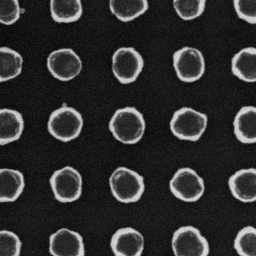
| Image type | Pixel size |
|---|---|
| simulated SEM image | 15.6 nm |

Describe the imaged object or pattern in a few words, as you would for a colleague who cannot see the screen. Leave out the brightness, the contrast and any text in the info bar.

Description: a regular array of raised bodies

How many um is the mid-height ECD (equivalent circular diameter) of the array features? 0.481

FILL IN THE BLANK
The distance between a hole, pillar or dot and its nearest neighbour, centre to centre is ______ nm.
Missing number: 933